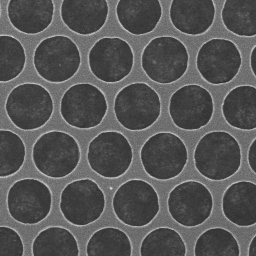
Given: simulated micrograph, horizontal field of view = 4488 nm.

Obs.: a regular array of holes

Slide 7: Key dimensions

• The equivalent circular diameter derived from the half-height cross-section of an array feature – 800 nm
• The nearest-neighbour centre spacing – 943 nanometres